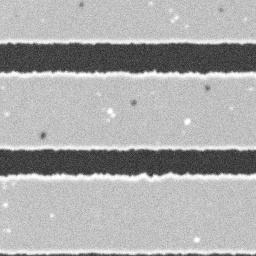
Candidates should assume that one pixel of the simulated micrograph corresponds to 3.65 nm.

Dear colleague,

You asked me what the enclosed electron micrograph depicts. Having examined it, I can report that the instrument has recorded lines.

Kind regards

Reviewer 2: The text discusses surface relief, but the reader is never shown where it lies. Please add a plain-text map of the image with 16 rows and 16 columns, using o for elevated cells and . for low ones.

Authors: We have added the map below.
oooooooooooooooo
oooooooooooooooo
oooooooooooooooo
................
................
oooooooooooooooo
oooooooooooooooo
oooooooooooooooo
oooooooooooooooo
................
................
oooooooooooooooo
oooooooooooooooo
oooooooooooooooo
oooooooooooooooo
oooooooooooooooo